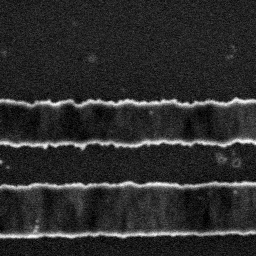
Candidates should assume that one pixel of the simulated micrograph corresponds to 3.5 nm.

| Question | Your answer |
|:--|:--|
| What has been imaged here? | lines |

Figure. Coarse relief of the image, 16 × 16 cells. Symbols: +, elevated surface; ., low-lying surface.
................
................
................
................
................
................
++++++++++++++++
++++++++++++++++
++++++++++++++++
................
................
........++...+++
++++++++++++++++
++++++++++++++++
++++++++++++++++
................